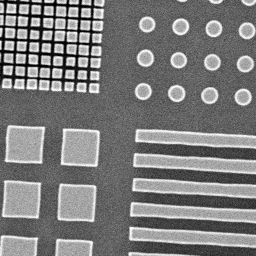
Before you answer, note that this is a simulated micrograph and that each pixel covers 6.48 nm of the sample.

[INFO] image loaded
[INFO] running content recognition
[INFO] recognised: groups of lines, slits or small figures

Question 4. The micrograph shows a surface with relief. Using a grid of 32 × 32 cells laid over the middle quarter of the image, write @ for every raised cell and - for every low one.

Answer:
----@@-@@-------------------@@--
--------------------------------
@@--@@-@------------------------
-@--@@-@------------------------
--------------------------------
@@-@@--@-----------@@-----------
@@-@@--@----------@@@@----@@@@--
------------------@@@@----@@@@--
-------------------@@------@@@--
--------------------------------
--------------------------------
--------------------------------
--------------------------------
--------------------------------
--------------------------------
--------------------------------
@@@@@---------------------------
@@@@@@@@@---------@@@@@@@@@@@@@@
@@@@@@@@@---------@@@@@@@@@@@@@@
@@@@@@@@@-----------@@@@@@@@@@@@
@@@@@@@@------------------------
@@@@@@@@------------------------
@@@@@@@@------------------------
@@@@@@@@----------@@@@@@@@@@@@@@
@@@@@@@@----------@@@@@@@@@@@@@@
------------------@@@@@@@@@@@@@@
--------------------------------
--------------------------------
--------------------------------
------------------@@@@@@@@@@@@@-
@@@@@@@----------@@@@@@@@@@@@@@@
@@@@@@@@---------@@@@@@@@@@@@@@@